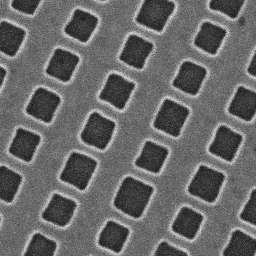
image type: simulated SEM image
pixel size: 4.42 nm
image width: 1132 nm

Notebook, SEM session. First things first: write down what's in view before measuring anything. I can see a regular array of holes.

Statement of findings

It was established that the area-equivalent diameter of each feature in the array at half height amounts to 141 nm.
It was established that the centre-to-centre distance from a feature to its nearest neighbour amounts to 194 nanometers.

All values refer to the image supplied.